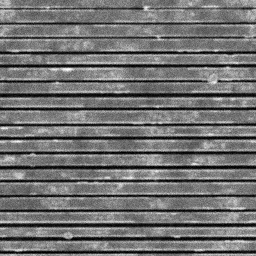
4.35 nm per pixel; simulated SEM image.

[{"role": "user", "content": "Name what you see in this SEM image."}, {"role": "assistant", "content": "parallel lines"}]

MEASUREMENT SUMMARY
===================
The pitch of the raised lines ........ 62.5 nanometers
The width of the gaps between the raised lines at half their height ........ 0.0169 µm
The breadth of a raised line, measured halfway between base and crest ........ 46.2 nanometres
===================